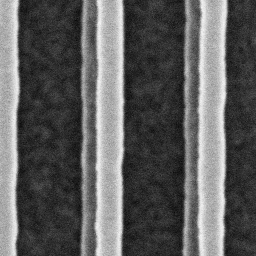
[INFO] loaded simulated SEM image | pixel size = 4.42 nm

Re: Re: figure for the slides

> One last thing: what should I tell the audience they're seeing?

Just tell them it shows lines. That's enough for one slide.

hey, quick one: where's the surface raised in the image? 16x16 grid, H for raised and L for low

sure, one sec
HLLLLHHHLLLLHHLL
HLLLLHHHLLLLHHLL
HLLLLHHHLLLLHHLL
HLLLLHHHLLLLHHLL
HLLLLHHHLLLLHHLL
HLLLLHHHLLLLHHLL
HLLLLHHHLLLLHHLL
HLLLLHHHLLLLHHLL
HLLLLHHHLLLLHHLL
HLLLLHHHLLLLHHLL
HLLLLHHHLLLLHHLL
HLLLLHHHLLLLHHLL
HLLLLHHHLLLLHHLL
HLLLLHHHLLLLHHLL
HLLLLHHHLLLLHHLL
HLLLLHHHLLLHHHLL